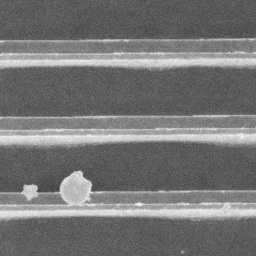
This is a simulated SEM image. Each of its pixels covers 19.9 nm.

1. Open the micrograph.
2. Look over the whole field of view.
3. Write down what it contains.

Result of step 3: lines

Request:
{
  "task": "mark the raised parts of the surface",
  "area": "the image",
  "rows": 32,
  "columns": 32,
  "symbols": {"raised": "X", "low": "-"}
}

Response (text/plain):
--------------------------------
--------------------------------
--------------------------------
--------------------------------
--------------------------------
XXXXXXXXXXXXXXXXXXXXXXXXXXXXXXXX
XXXXXXXXXXXXXXXXXXXXXXXXXXXXXXXX
XXXXXXXXXXXXXXXXXXXXXXXXXXXXXXXX
--------------------------------
--------------------------------
--------------------------------
--------------------------------
--------------------------------
--------------------------------
----------------------------XXXX
XXXXXXXXXXXXXXXXXXXXXXXXXXXXXXXX
XXXXXXXXXXXXXXXXXXXXXXXXXXXXXXXX
--------------------------------
--------------------------------
--------------------------------
--------------------------------
---------X----------------------
--------XXX---------------------
---XX---XXX---------------------
XXXXXXXXXXXXXXXXXXXXXXXXXXXXXXXX
XXXXXXXXXXXXXXXXXXXXXXXXXXXXXXXX
XXXXXXXXXXX-----------------X---
--------------------------------
--------------------------------
--------------------------------
--------------------------------
--------------------------------